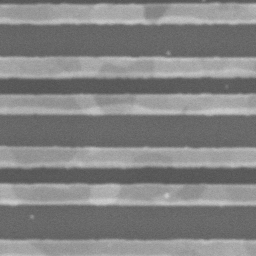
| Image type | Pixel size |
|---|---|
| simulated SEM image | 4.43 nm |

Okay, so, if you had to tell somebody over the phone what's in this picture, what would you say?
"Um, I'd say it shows lines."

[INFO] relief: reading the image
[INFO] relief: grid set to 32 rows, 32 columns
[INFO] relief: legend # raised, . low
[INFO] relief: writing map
................................
################################
################################
................................
................................
................................
................................
################################
################################
#########....##.................
................................
................................
################################
################################
................................
................................
................................
................................
########........................
################################
################################
................................
................................
################################
################################
..................#####....#####
................................
................................
................................
................................
################################
################################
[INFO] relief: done